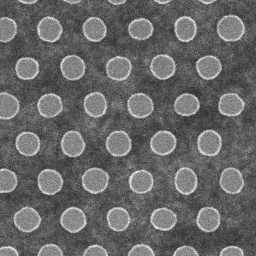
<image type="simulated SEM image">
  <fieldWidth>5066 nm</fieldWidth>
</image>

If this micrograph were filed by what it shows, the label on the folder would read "a regular array of raised bodies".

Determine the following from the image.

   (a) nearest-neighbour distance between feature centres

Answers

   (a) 865 nm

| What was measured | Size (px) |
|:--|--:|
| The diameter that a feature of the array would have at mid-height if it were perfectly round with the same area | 23.9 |